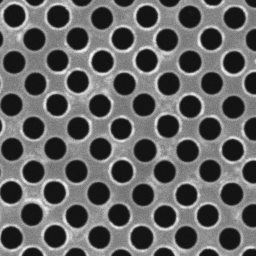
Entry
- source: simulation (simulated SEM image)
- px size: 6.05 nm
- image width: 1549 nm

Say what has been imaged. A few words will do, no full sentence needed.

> a regular array of holes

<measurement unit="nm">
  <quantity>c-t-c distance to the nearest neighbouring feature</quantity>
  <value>181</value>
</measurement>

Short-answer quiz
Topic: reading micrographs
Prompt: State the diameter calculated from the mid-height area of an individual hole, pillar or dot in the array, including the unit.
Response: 138 nanometres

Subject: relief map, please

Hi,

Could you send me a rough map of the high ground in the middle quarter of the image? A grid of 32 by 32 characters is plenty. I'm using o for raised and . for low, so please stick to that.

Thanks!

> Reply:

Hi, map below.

.oooooo.....oooooo.....oooooo...
oooooooo....ooooooo...ooooooo...
oo....ooooooo...ooooooooo...oooo
o.....ooooooo.....oooooo.....ooo
o.....oooooo......ooooo......ooo
o.....oooooo......ooooo......ooo
o....oooooooo.....oooooo.....ooo
oooooooooooooo...oo..oooo...oooo
ooooooo....ooooooo....oooooooo..
.ooooo......ooooo......oooooo...
.ooooo......ooooo......oooooo...
.ooooo......ooooo......oooooo...
ooooooo....ooooooo....ooooooo...
oo...ooooooooo.ooooooooo....ooo.
o.....oooooo....ooooooo......ooo
o.....oooooo.....oooooo......ooo
o.....oooooo.....oooooo......ooo
o.....oooooo.....ooooooo....oooo
oo...ooo.oooo...ooooooooo.oooooo
ooooooo....ooooooo....ooooooo...
.oooooo.....oooooo.....ooooo....
.ooooo......ooooo......ooooo....
ooooooo.....ooooo......ooooo....
ooooooo....ooooooo.....oooooo...
o....oooooooo...oooo.ooo...ooo.o
o.....oooooo.....oooooo.....oooo
......oooooo.....ooooo......oooo
......oooooo.....oooooo.....oooo
o....ooooooo.....oooooo.....oooo
oo..ooooooooo...oooooooo...ooooo
oooooo.....ooooooo...oooooooo...
oooooo.....oooooo.....oooooo....